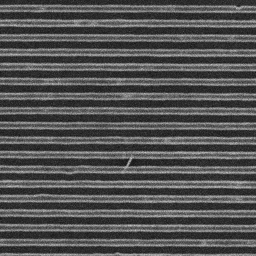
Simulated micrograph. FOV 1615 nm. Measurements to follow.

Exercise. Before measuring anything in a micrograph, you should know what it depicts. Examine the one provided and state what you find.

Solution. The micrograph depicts parallel lines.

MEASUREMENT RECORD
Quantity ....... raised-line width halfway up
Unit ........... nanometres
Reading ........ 39.5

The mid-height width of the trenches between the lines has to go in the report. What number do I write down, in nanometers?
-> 56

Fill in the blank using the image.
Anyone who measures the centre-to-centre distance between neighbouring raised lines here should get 92.2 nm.